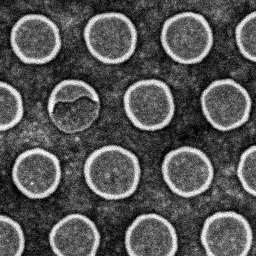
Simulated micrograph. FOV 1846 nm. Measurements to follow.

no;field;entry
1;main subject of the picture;a regular array of raised bodies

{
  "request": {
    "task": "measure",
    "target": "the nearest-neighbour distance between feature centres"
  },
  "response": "545 nm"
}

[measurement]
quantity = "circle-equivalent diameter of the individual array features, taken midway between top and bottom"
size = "338 nm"